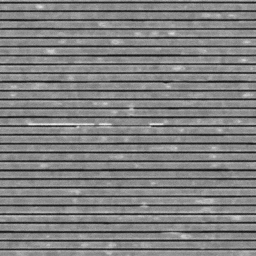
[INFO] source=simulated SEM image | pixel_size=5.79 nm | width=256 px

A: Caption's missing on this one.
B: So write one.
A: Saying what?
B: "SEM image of parallel lines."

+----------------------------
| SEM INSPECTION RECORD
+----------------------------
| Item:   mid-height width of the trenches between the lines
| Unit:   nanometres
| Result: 10.9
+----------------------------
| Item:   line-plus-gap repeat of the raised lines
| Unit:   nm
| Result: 51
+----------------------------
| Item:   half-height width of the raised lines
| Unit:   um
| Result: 0.0384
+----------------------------